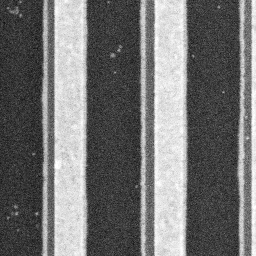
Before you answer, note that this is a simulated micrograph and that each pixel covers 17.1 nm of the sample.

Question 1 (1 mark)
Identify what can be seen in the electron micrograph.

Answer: lines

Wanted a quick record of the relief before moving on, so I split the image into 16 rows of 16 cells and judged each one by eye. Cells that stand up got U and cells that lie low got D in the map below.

DDDUUDDDDUUDDDDU
DDDUUDDDDUUDDDDU
DDDUUDDDDUUDDDDU
DDDUUDDDDUUDDDDU
DDDUUDDDDUUDDDDU
DDDUUDDDDUUDDDDU
DDDUUDDDDUUDDDDU
DDDUUDDDDUUDDDDU
DDDUUDDDDUUDDDDU
DDDUUDDDDUUDDDDU
DDDUUDDDDUUDDDDU
DDDUUDDDDUUDDDDU
DDDUUDDDDUUDDDDU
DDDUUDDDDUUDDDDU
DDDUUDDDDUUDDDDU
DDDUUDDDDUUDDDDU